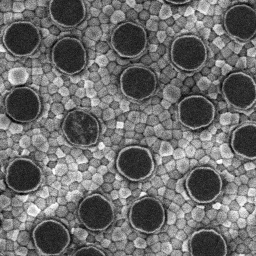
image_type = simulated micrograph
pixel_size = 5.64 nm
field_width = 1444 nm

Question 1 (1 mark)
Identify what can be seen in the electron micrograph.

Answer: a regular array of raised bodies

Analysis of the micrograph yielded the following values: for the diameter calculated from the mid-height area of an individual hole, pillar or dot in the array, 199 nm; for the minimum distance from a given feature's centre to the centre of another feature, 301 nm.